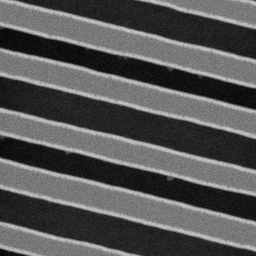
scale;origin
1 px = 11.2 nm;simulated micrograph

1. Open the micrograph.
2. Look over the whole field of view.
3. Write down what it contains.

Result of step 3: lines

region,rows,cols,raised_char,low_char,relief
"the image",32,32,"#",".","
####................############
########...............#########
############...............#####
.###############...............#
.....###############............
.........###############........
##...........###############....
#######...........##############
###########...........##########
###############...........######
....###############..........###
........###############.........
............###############.....
................###############.
####.................###########
########.................#######
#############................###
...##############...............
......###############...........
...........##############.......
###............##############...
#######............#############
###########............#########
###############............#####
....################............
........###############.........
............###############.....
................###############.
###.................############
#######.................########
############................####
..##############................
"